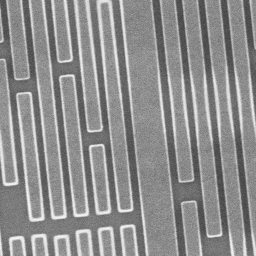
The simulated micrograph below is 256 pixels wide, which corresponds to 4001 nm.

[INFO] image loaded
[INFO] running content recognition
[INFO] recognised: groups of lines, slits or small figures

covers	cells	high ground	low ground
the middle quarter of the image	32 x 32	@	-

----@@@@--@@@---@@@@@@@---@@@--@
----@@@@--@@@---@@@@@@@---@@@@-@
----@@@@--@@@@--@@@@@@@@--@@@@--
@@---@@@--@@@@--@@@@@@@@--@@@@--
@@@--@@@--@@@@--@@@@@@@@--@@@@--
@@@--@@@---@@@--@@@@@@@@---@@@--
@@@--@@@---@@@--@@@@@@@@---@@@--
@@@--@@@---@@@---@@@@@@@---@@@--
@@@--@@@@--@@@---@@@@@@@---@@@--
@@@--@@@@--@@@---@@@@@@@---@@@--
@@@--@@@@--@@@@--@@@@@@@---@@@--
@@@--@@@@--@@@@--@@@@@@@@--@@@--
@@@@--@@@--@@@@--@@@@@@@@--@@@@-
@@@@--@@@--@@@@--@@@@@@@@--@@@@-
@@@@--@@@--@@@@--@@@@@@@@--@@@@-
@@@@--@@@---@@@--@@@@@@@@--@@@@-
@@@@--@@@---@@@--@@@@@@@@---@@@-
-@@@--------@@@--@@@@@@@@---@@@-
-@@@--------@@@---@@@@@@@---@@@-
-@@@--------@@@@--@@@@@@@@--@@@-
-@@@----@@--@@@@--@@@@@@@@--@@@-
-@@@---@@@--@@@@--@@@@@@@@--@@@@
-@@@---@@@--@@@@--@@@@@@@@--@@@@
-@@@---@@@--@@@@--@@@@@@@@--@@@@
-@@@@--@@@--@@@@--@@@@@@@@--@@@@
-@@@@--@@@--@@@@--@@@@@@@@--@@@@
-@@@@--@@@---@@@---@@@@@@@---@@@
-@@@@--@@@@--@@@---@@@@@@@---@@@
--@@@--@@@@--@@@---@@@@@@@@--@@@
--@@@---@@@--@@@---@@@@@@@@-----
--@@@---@@@--@@@---@@@@@@@@-----
--@@@---@@@--@@@@--@@@@@@@@-----